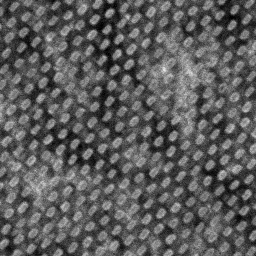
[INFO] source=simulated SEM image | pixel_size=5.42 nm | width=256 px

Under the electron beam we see a regular array of raised bodies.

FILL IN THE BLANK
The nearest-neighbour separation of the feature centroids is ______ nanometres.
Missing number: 84